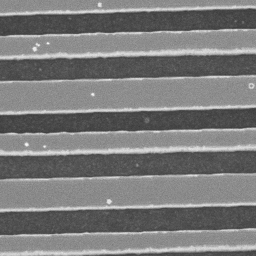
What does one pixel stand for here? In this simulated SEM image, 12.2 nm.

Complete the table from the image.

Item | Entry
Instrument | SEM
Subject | lines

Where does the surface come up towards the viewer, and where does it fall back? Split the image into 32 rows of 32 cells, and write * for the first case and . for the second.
********************************
**************..................
................................
................................
.*******************************
********************************
********************************
................................
................................
..............................**
********************************
********************************
********************************
******************************..
................................
................................
.............***.***************
********************************
********************************
................................
................................
................................
.*******************************
********************************
********************************
********************************
................................
................................
................................
********************************
********************************
*******************.............